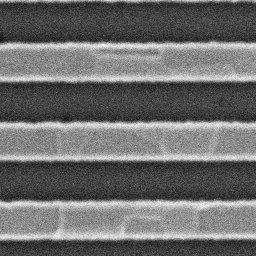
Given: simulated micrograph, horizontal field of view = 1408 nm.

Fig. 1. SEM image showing lines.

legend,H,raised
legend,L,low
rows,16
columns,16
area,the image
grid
LLLLLLLLLLLLLLLL
LLLLLLLLLLLLLLLL
LLLLLLLLLLLLLLLL
HHHHHHHHHHHHHHHH
HHHHHHHHHHHHHHHH
LLLLLLLLLLLLLLLL
LLLLLLLLLLLLLLLL
LLLLLLLLLLLLLLLL
HHHHHHHHHHHHHHHH
HHHHHHHHHHHHHHHH
LLLLLLLLLLLLLLLL
LLLLLLLLLLLLLLLL
LLLLLLLLLLLLLLLL
HHHHHHHHHHHHHHHH
HHHHHHHHHHHHHHHH
LLLLLLLLLLLLLLLL